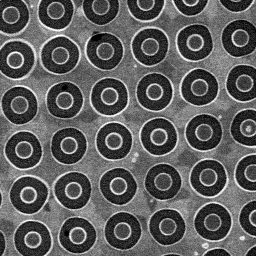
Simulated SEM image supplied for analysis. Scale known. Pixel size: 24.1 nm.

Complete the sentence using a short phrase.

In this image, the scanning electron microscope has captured an array of small figures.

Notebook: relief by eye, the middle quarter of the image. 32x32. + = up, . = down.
...+++++.....++++++++.++++++++++
..++++++++.+++++++++++++++++++++
+++++++++++++++++++++...+++++++.
++++++++++..++++++++......++++..
.+++++++......+++++........++...
...++++........+++....++...++...
....+++...++....++...++++..++...
+...+++..++++...++...+++...++...
++...++...+++...++....++...+++..
++...++...+++...+++........++++.
++...++.........+++.......++++++
....++++.......++++++...++++++++
...++++++....+++++++++++++++++++
..+++++++++++++++++++++..+++++++
++++++++++++.++++++++......++++.
++++++++++.....+++++........+++.
....+++++.......+++.....+...++..
.....+++....+....++...+++...++..
.....+++...+++...++...+++...++..
+++...++...+++...++...+++...+++.
+++...++...+++...+++........++++
+++...++.........+++.......+++++
.....++++.......++++++....++++++
....++++++.....+++++++++++++++++
...+++++++++++++++++++++++++++++
++++++++++++++++++++++.....+++++
++++++++++++....+++++.......++++
.....+++++.......++++....+...+++
......+++........+++...++++..++.
......+++...+++...++...++++..+++
.+++...++...++++..++...++++..+++
.+++...++...+++...+++...+....+++